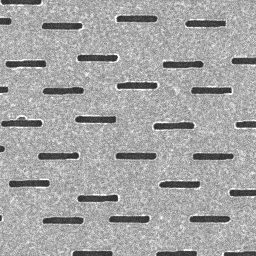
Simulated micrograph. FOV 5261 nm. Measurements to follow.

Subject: a regular array of holes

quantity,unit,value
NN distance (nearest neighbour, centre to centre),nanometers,891